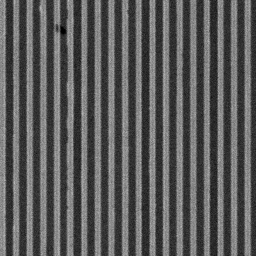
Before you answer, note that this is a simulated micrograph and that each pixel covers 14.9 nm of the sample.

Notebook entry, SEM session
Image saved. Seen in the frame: parallel lines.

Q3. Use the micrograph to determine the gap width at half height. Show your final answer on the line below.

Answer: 123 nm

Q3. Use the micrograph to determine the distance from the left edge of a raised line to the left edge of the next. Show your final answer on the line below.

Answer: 13.6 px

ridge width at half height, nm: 68.9